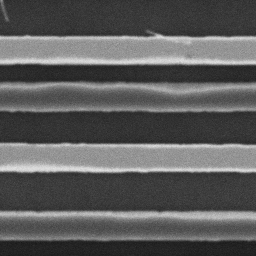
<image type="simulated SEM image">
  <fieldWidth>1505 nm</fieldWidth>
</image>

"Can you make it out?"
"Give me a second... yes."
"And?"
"lines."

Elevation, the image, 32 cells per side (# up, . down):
................................
................................
................................
................................
................................
################################
################################
################################
................................
................................
......###.......................
################################
################################
################################
................................
................................
................................
................................
################################
################################
################################
................................
................................
................................
................................
................................
................................
################################
################################
################################
................................
................................